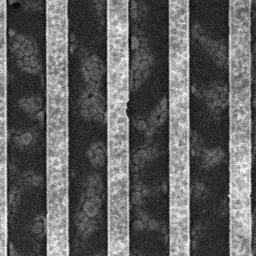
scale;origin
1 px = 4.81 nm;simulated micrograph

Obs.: one or a few lines or trenches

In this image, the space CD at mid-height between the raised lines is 199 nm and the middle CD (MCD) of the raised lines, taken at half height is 19.8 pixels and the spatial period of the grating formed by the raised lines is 293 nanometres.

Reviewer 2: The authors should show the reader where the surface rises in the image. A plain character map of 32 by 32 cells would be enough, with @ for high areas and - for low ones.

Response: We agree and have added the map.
@-----@@------@@-----@@@-----@@-
@-----@@------@@-----@@@-----@@-
@-----@@------@@-----@@@-----@@-
@-----@@------@@-----@@@-----@@-
@-----@@------@@-----@@------@@-
@-----@@------@@-----@@------@@-
@-----@@------@@-----@@------@@-
@-----@@------@@-----@@------@@-
@-----@@------@@-----@@------@@-
@-----@@------@@-----@@@-----@@-
@-----@@------@@-----@@------@@-
@-----@@------@@-----@@------@@-
@-----@@------@@-----@@------@@-
@-----@@------@@-----@@------@@-
@-----@@------@@-----@@------@@-
@-----@@------@@-----@@------@@-
@-----@@------@@-----@@@-----@@-
@-----@@------@@-----@@------@@-
@-----@@------@@-----@@------@@-
@-----@@------@@-----@@------@@-
@-----@@------@@-----@@@-----@@-
@-----@@------@@-----@@@-----@@-
@-----@@------@@-----@@@-----@@-
@-----@@------@@-----@@@-----@@-
@-----@@------@@-----@@@-----@@-
@-----@@------@@-----@@@-----@@-
@-----@@------@@-----@@@-----@@-
@-----@@------@@-----@@@-----@@-
@-----@@------@@-----@@@-----@@-
@-----@@------@@-----@@@-----@@-
@-----@@------@@-----@@@-----@@-
@-----@@------@@-----@@@-----@@-